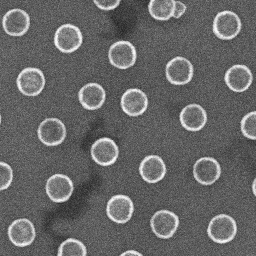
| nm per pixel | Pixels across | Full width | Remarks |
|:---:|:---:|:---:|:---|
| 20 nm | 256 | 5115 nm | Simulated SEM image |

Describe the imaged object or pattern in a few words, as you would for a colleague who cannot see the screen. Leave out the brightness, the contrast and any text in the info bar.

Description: a regular array of raised bodies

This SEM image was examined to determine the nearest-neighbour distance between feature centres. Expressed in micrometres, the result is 1.08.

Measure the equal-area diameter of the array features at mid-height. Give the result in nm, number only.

531